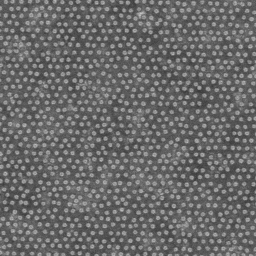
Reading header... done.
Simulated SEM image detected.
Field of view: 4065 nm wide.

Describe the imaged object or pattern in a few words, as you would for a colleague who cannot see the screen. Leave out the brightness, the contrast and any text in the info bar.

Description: a regular array of raised bodies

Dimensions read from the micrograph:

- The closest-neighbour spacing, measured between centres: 107 nanometres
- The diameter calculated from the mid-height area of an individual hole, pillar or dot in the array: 53.7 nanometers